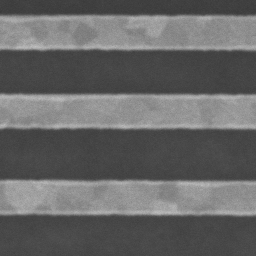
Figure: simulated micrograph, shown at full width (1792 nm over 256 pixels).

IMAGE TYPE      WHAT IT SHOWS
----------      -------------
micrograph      lines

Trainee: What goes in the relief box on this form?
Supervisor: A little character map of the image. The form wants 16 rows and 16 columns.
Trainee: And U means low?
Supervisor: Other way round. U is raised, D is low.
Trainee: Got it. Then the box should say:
DDDDDDDDDDDDDDDD
UUUUUUUUUUUUUUUU
UUUUUUUUUUUUUUUU
DDDDDDDDDDDDDDDD
DDDDDDDDDDDDDDDD
DDDDDDDDDDDDDDDD
UUUUUUUUUUUUUUUU
UUUUUUUUUUUUUUUU
DDDDDDDDDDDDDDDD
DDDDDDDDDDDDDDDD
DDDDDDDDDDDDDDDD
UUUUUUUUUUUUUUUU
UUUUUUUUUUUUUUUU
DDDDDDDDDDDDDDDD
DDDDDDDDDDDDDDDD
DDDDDDDDDDDDDDDD